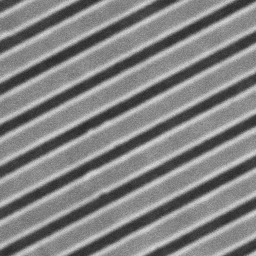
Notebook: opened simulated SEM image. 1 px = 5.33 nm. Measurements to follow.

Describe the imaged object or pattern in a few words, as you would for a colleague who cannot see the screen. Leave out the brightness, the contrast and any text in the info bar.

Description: parallel lines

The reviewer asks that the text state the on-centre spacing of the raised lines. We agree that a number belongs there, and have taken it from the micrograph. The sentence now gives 0.195 microns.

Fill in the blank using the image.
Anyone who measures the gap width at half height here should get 71.2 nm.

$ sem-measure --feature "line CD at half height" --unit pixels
23.4